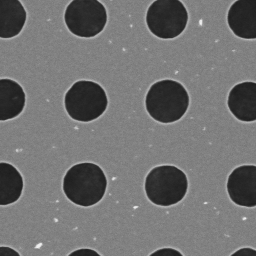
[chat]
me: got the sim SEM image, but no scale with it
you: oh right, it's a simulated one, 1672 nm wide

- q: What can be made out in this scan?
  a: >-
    holes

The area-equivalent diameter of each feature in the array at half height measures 273 nm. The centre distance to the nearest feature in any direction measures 81.2 pixels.